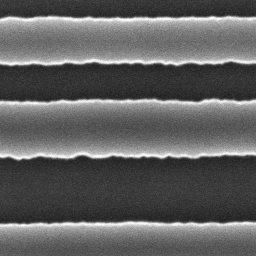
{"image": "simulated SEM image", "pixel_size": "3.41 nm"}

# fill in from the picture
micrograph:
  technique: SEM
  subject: lines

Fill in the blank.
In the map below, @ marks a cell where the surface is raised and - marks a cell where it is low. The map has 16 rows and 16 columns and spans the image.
----------------
@@@@@@@@@@@@@@@@
@@@@@@@@@@@@@@@@
@@@@@@@@@@@@@@@@
----------------
----------------
@@@@@@@@@@@@@@@@
@@@@@@@@@@@@@@@@
@@@@@@@@@@@@@@@@
@@@@@@@@@@@@@@@@
----------------
----------------
----------------
----------------
@@@@@@@@@@@@@@@@
@@@@@@@@@@@@@@@@